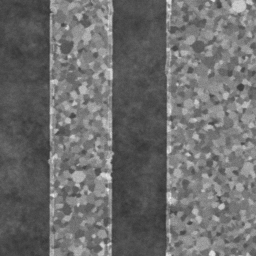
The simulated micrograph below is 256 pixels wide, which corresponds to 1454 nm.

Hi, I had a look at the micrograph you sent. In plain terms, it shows one or a few lines or trenches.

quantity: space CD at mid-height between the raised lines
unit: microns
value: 0.32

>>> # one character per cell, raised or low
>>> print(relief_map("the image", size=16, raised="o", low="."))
...oooo...oooooo
...oooo...oooooo
...oooo...oooooo
...oooo...oooooo
...oooo...oooooo
...oooo....ooooo
...oooo....ooooo
...oooo....ooooo
...oooo....ooooo
...oooo....ooooo
...oooo....ooooo
...oooo....ooooo
...oooo...oooooo
...oooo...oooooo
...oooo...oooooo
...oooo...oooooo